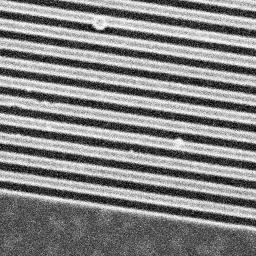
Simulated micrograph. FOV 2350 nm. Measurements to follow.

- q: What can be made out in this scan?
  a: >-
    parallel lines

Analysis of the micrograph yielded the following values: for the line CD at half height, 73.7 nm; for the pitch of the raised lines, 172 nm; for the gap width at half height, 10 pixels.